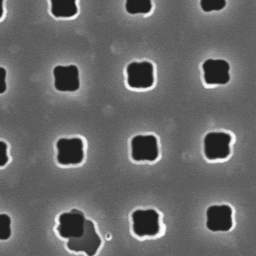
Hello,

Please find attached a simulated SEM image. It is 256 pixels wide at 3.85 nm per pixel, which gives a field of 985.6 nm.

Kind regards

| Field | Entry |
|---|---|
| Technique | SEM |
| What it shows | a regular array of holes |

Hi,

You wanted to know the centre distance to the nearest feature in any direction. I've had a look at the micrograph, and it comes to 281 nanometres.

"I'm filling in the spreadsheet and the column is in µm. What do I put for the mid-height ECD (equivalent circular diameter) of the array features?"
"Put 0.102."